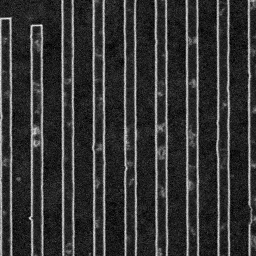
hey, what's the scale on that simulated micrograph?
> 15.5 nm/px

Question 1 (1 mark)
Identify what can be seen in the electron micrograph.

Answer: parallel lines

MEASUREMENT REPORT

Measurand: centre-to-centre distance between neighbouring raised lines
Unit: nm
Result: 480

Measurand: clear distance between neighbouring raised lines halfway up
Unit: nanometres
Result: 311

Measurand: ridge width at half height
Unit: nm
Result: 168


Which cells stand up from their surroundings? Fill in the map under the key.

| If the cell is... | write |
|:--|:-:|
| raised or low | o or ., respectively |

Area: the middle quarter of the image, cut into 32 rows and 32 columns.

oo......oo......oo.....ooo.....o
oo......oo......oo.....oo......o
oo......oo.....ooo.....ooo.....o
oo......oo.....ooo.....ooo.....o
oo......oo.....ooo.....oo......o
oo......oo.....ooo.....ooo.....o
oo......oo.....ooo.....ooo.....o
oo......oo.....ooo.....ooo.....o
oo......oo.....ooo.....ooo.....o
oo......oo.....ooo.....ooo.....o
oo......oo.....ooo.....ooo.....o
oo......oo.....ooo.....ooo.....o
oo......oo.....ooo.....ooo.....o
oo......oo......oo.....oo......o
oo......oo.....ooo.....ooo.....o
oo......oo.....ooo.....ooo.....o
oo......oo.....ooo.....ooo.....o
oo......oo.....ooo.....ooo.....o
oo......oo.....ooo.....ooo.....o
oo......oo.....ooo.....ooo.....o
oo.....ooo.....ooo.....ooo.....o
oo.....ooo.....ooo.....ooo.....o
oo......oo.....ooo.....ooo.....o
oo......oo.....ooo.....oo......o
oo......oo......oo.....oo......o
oo......oo......oo.....oo......o
oo......oo......oo.....oo......o
oo......oo.....ooo.....oo......o
oo......oo.....ooo.....ooo.....o
oo......oo.....ooo.....oo......o
oo......oo.....ooo.....oo......o
oo......oo.....ooo.....oo......o